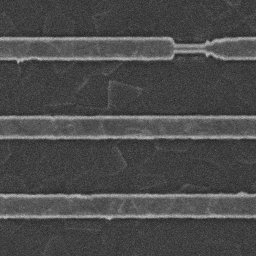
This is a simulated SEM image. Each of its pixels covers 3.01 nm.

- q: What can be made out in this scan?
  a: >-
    one or a few lines or trenches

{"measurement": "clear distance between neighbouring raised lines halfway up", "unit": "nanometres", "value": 172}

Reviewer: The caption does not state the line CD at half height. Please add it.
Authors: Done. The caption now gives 64.4 nm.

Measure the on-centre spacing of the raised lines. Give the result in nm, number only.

237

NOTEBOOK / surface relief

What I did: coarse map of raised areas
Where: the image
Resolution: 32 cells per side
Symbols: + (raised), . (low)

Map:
................................
................................
................................
................................
................................
++++++++++++++++++++++....++++++
++++++++++++++++++++++...+++++++
..+.............................
................................
................................
................................
................................
................................
................................
................................
++++++++++++++++++++++++++++++++
++++++++++++++++++++++++++++++++
................................
................................
................................
................................
................................
................................
................................
++++++++++.+++++++++++++++++++++
++++++++++++++++++++++++++++++++
++++++++++++++++++++++++++++++++
................................
................................
................................
................................
................................